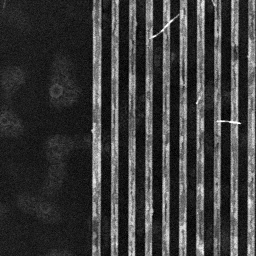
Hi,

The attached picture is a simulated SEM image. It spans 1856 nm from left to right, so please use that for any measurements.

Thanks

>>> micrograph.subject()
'parallel lines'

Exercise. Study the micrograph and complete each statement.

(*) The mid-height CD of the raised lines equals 46.2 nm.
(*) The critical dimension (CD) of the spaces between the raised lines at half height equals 78.9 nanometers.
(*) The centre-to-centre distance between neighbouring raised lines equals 125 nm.